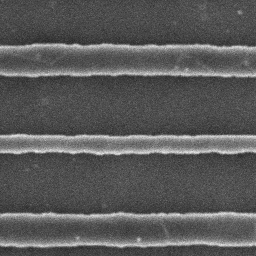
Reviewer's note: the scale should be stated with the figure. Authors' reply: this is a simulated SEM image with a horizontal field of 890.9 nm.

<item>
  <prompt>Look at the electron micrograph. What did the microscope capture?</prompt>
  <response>lines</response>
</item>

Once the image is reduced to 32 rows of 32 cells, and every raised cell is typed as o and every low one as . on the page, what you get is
................................
................................
................................
................................
................................
................................
oooooooooooooooooooooooooooooooo
oooooooooooooooooooooooooooooooo
oooooooooooooooooooooooooooooooo
...oo......................oo.oo
................................
................................
................................
................................
................................
................................
................................
oooooooooooooooooooooooooooooooo
oooooooooooooooooooooooooooooooo
................................
................................
................................
................................
................................
................................
................................
................................
oooooooooooooooooooooooooooooooo
oooooooooooooooooooooooooooooooo
oooooooooooooooooooooooooooooooo
oooooooooooooooooooooooo..oooooo
................................